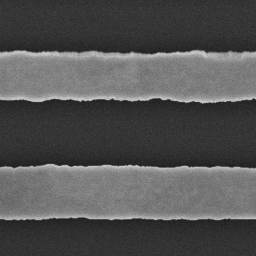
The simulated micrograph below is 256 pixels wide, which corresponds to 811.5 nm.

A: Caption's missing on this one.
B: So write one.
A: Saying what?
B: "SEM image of lines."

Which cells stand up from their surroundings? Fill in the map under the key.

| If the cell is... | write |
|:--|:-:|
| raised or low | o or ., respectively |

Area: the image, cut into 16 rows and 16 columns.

................
................
................
oooooooooooooooo
oooooooooooooooo
oooooooooooooooo
................
................
................
................
oooooooooo.oooo.
oooooooooooooooo
oooooooooooooooo
oooooooooooooooo
................
................